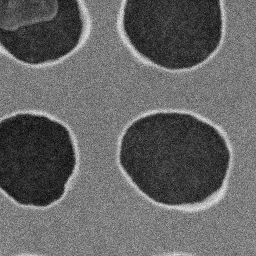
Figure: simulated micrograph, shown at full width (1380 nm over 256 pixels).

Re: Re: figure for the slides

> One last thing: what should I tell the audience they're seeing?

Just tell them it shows holes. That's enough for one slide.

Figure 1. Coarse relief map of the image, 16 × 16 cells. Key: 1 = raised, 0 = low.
0000011100000011
0000011100000011
0000011100000011
1000111110000111
1111111111111111
1111111111111111
1111111111111111
0001111110000111
0000111100000011
0000011000000011
0000011100000011
0000111100000011
1000111111000111
1111111111111111
1111111111111111
1111111111111111